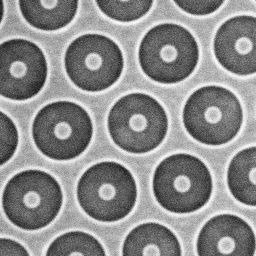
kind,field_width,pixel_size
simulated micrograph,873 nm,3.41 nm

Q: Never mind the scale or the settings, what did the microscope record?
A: an array of small figures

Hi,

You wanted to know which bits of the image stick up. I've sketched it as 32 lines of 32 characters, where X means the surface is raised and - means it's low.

XX--------XX-------XXX------XXXX
-XX-------XXX------XXXX----XXXXX
XXX------XXXXX---XXXXXXXXXXX----
XXXX----XXXXXXXXXXX----XXXX-----
XXXXXXXXXX---XXXXX------XXX-----
----XXXXX------XX--------XX-----
-----XXX-------XX--------XX-----
------XX-------XX--------XX-----
------XX-------XXX------XXXX----
------XX-------XXX------XXXXXX-X
------XXX-----XXXXXX-XXXXXXXXXXX
-----XXXXXX-XXXXXXXXXXXX-----XXX
X--XXXXXXXXXXXX-----XXX-------XX
XXXXX-----XXXX------XXX-------XX
-XXX-------XX--------XX-------XX
--XX--------X--------XX-------XX
--XX--------XX-------XX-------XX
--XX-------XXX------XXXX-----XXX
--XXX------XXXX-----XXXXXXXXXXX-
--XXXX----XXXXXXXXXXX---XXXXX---
XXXXXXXXXXXX---XXXXX------XXX---
XX----XXXX------XXX-------XX----
X------XXX-------XX--------X----
X-------XX-------XX--------XX---
--------XX-------XX-------XXX---
--------XX-------XXX------XXXX--
-------XXXX-----XXXXX---XXXXXXXX
X------XXXXX---XXXXXXXXXXX-----X
XX---XXXXXXXXXXXX----XXXX------X
XXXXXXX-----XXXX------XXX-------
---XXX-------XX-------XX--------
----XX-------XX--------XX-------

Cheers